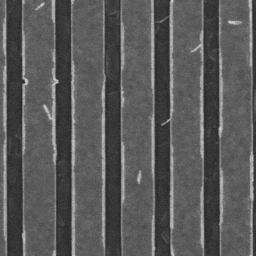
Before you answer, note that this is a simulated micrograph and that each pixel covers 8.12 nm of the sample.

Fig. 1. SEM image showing parallel lines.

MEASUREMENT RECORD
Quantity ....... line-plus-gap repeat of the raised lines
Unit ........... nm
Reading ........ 400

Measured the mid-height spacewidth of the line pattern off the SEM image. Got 134 nanometers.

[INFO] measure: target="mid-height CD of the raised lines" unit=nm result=268